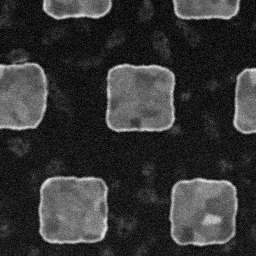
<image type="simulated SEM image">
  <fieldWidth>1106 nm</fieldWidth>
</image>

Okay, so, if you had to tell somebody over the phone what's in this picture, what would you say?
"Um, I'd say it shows raised bodies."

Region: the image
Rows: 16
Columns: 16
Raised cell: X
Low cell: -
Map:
---XXXX----XXXX-
----------------
----------------
----------------
XXX----XXXX----X
XXX----XXXX----X
XXX----XXXX----X
XX-----XXXX----X
----------------
----------------
----------------
---XXX-----XXX--
---XXXX----XXXX-
---XXXX----XXXX-
---XXX-----XXXX-
----------------